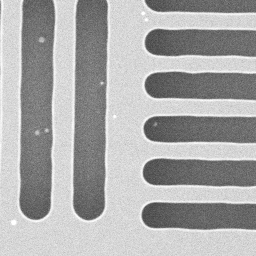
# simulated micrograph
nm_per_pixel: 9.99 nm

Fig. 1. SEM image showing groups of lines, slits or small figures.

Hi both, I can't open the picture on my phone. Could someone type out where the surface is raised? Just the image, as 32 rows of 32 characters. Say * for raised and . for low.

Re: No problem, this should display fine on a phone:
***....***...*****..............
***....**....*******............
***....**....*******************
***....**.....******************
***....**....*****..............
***....**....*****..............
***....**....******.............
***....**....*******************
***....**....*******************
***....**....******.............
**.....**....*****..............
**.....**....*****..............
**.....**....************.......
**.....**....*******************
**.....**....*******......******
**.....**....*****..............
**.....**....*****..............
**.....**....******.............
**....***....*******************
**....***....*******************
**.....**....*****..............
**.....**....*****..............
**.....**....*****..............
**....***....*******************
**....***....*******************
**....***....******.............
***...***....*****..............
****.*****..******..............
*******************.............
********************************
********************************
********************************